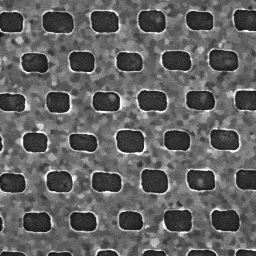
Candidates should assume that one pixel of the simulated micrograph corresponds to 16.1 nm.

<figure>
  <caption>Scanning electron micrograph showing a regular array of holes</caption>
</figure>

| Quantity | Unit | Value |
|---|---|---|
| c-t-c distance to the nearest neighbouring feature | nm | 741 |